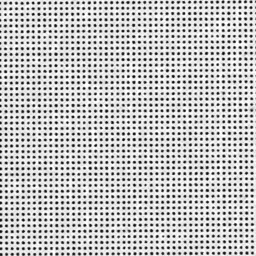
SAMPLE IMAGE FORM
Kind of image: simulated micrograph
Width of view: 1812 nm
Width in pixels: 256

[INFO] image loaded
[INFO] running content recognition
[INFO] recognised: a regular array of holes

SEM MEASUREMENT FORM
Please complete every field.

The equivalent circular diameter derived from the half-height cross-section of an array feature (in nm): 22.6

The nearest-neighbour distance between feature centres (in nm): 37.7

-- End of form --